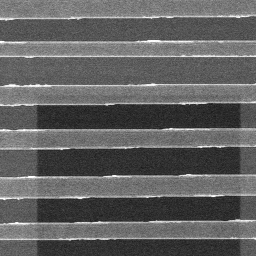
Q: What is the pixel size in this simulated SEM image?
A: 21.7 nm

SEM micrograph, lines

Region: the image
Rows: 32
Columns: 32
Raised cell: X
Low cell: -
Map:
XXXXXXXXXXXXXXXXXXXXXXXXXXXXXXXX
XXXXXXXXXXXXXXXXXXXXXXXXXXXXXXXX
--------------------------------
--------------------------------
--------------------------------
XXXXXXXXXXXXXXXXXXXXXXXXXXXXXXXX
XXXXXXXXXXXXXXXXXXXXXXXXXXXXXXXX
--------------------------------
--------------------------------
--------------------------------
--------------------------------
XXXXXXXXXXXXXXXXXXXXXXXXXXXXXXXX
XXXXXXXXXXXXXXXXXXXXXXXXXXXXXXXX
--------------------------------
--------------------------------
--------------------------------
XXXXXXXXXXXXXXXXXXXXXXXXXXXXXXXX
XXXXXXXXXXXXXXXXXXXXXXXXXXXXXXXX
XXXXXXXXX-----------------------
--------------------------------
--------------------------------
--------------------------------
XXXXXXXXXXXXXXXXXXXXXXXXXXXXXXXX
XXXXXXXXXXXXXXXXXXXXXXXXXXXXXXXX
XXXXXXXXXXXXXXXXXXXX------------
--------------------------------
--------------------------------
--------------------------------
XXXXXXXXXXXXXXXXXXXXXXXXXXXXXXXX
XXXXXXXXXXXXXXXXXXXXXXXXXXXXXXXX
--------------------------------
--------------------------------